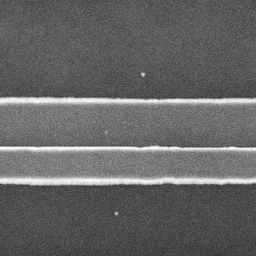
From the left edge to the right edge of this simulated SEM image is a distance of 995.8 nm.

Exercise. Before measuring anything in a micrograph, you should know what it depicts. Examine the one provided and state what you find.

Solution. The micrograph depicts lines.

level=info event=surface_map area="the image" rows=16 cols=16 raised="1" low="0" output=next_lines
0000000000000000
0000000000000000
0000000000000000
0000000000000000
0000000000000000
0000000000000000
1111111111111111
1111111111111111
1111111111111111
1111111111111111
1111111111111111
0000000000000000
0000000000000000
0000000000000000
0000000000000000
0000000000000000